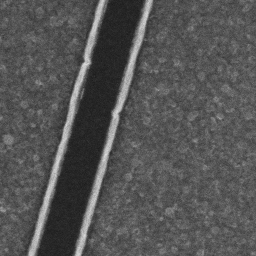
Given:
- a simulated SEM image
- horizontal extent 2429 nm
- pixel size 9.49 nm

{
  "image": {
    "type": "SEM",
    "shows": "one or a few lines or trenches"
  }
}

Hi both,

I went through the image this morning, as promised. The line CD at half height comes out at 433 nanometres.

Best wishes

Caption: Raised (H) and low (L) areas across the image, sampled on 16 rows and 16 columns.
LLLLLLHHHLLLLLLL
LLLLLLHHHLLLLLLL
LLLLLLHHHLLLLLLL
LLLLLHHHLLLLLLLL
LLLLLHHHLLLLLLLL
LLLLLHHHLLLLLLLL
LLLLLHHHLLLLLLLL
LLLLHHHLLLLLLLLL
LLLLHHHLLLLLLLLL
LLLLHHHLLLLLLLLL
LLLHHHLLLLLLLLLL
LLLHHHLLLLLLLLLL
LLLHHHLLLLLLLLLL
LLLHHHLLLLLLLLLL
LLHHHLLLLLLLLLLL
LLHHHLLLLLLLLLLL